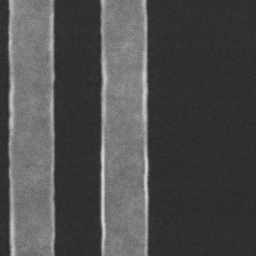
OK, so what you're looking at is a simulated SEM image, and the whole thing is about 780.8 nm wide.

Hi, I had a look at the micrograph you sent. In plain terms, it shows wiring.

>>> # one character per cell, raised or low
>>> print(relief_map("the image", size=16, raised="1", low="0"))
0110001110000000
0110001000000000
0110000000000000
0110001110000000
0110001110000000
0110001110000000
0110001110000000
0110001110000000
0110000000000000
0000000000000000
0000000000000000
0110000000000000
0110000000000000
0110000000000000
0110000000000000
0110000000000000